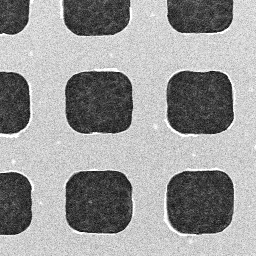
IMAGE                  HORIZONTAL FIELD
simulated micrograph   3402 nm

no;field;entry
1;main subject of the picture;holes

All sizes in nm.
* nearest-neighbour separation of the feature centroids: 1320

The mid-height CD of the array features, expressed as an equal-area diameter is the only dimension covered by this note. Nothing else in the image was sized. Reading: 933 nm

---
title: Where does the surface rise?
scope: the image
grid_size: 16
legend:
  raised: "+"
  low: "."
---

..++....++.....+
..++....+++...++
++++++++++++++++
++++++++++++++++
.++++..++++...++
..++....++....++
..++....++.....+
..++....+++....+
++++++++++++++++
++++++++++++++++
++++++++++++++++
..++....+++....+
..++....++.....+
..++....++.....+
.++++..++++...++
++++++++++++++++